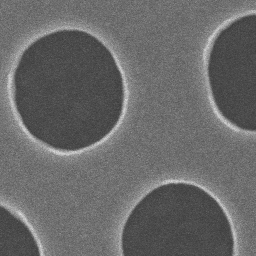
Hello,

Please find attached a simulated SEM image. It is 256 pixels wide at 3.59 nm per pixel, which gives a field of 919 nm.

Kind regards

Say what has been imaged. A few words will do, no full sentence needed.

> holes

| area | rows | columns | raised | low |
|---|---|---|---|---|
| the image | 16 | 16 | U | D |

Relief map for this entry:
UUUUUUUUUUUUUUUU
UUUUUUUUUUUUUUDD
UUDDDDUUUUUUUDDD
UDDDDDDUUUUUUDDD
UDDDDDDUUUUUUDDD
UDDDDDDDUUUUUDDD
UDDDDDDDUUUUUDDD
UDDDDDDUUUUUUUDD
UUDDDDDUUUUUUUUU
UUUUUUUUUUUUUUUU
UUUUUUUUUUUUUUUU
UUUUUUUUUUUDUUUU
UUUUUUUUUDDDDUUU
DUUUUUUUDDDDDDUU
DDUUUUUUDDDDDDUU
DDUUUUUUDDDDDDDU